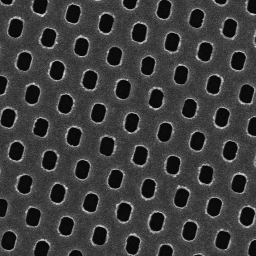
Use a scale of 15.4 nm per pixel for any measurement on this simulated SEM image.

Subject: a regular array of holes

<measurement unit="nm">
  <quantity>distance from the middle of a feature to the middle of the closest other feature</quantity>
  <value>522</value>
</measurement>